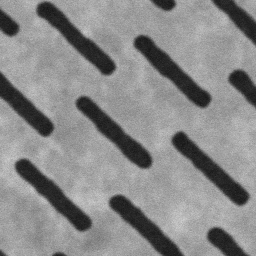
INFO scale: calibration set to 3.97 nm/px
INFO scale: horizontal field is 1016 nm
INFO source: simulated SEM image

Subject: holes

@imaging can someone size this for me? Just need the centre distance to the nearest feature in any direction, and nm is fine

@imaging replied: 346